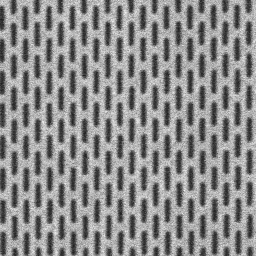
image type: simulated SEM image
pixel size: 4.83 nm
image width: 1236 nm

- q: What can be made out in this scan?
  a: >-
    a regular array of holes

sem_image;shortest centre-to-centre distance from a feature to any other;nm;94.6